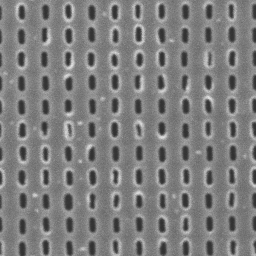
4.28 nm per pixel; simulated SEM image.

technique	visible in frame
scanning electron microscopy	a regular array of holes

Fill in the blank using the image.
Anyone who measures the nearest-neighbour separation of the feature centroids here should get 0.0973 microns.